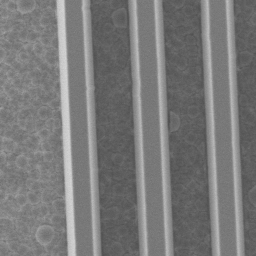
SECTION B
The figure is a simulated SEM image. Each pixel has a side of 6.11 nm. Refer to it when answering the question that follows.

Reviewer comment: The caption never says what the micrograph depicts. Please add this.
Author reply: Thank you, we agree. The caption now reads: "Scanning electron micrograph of one or a few lines or trenches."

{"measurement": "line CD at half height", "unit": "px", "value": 27.5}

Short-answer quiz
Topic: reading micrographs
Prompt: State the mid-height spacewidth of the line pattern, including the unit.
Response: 272 nm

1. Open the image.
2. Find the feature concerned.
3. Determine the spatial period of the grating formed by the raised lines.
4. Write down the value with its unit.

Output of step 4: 439 nanometers